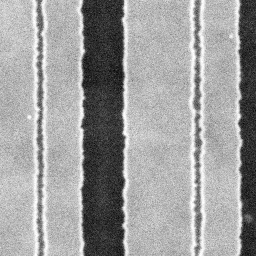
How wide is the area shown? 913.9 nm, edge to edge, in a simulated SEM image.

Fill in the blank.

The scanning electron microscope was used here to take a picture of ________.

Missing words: lines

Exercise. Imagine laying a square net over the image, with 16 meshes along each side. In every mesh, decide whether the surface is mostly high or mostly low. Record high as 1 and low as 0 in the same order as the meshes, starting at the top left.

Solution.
1111100011111110
1111100011111110
1111100011111110
1111100011111110
1111100011111110
1111100011111110
1111100011111110
1111100011111110
1111100011111110
1111100011111110
1111100011111110
1111100011111110
1111100011111110
1111100011111110
1111100011111110
1111100011111110